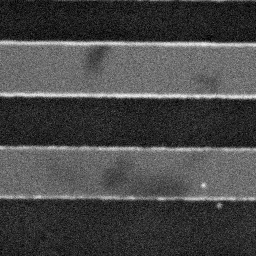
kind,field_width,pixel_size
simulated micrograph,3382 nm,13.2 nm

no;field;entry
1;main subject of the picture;lines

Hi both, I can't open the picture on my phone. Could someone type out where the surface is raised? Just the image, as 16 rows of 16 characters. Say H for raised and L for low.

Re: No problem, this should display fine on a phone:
LLLLLLLLLLLLLLLL
LLLLLLLLLLLLLLLL
LLLLLLLLLLLLLLLL
HHHHHHHHHHHHHHHH
HHHHHHHHHHHHHHHH
HHHHHHHHHHHHHHHH
LLLLLLLLLLLLLLLL
LLLLLLLLLLLLLLLL
LLLLLLLLLLLLLLLL
HHHHHHHHHHHHHHHH
HHHHHHHHHHHHHHHH
HHHHHHHHHHHHHHHH
LLLLLLLLLLLLLLLL
LLLLLLLLLLLLLLLL
LLLLLLLLLLLLLLLL
LLLLLLLLLLLLLLLL